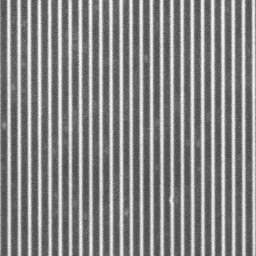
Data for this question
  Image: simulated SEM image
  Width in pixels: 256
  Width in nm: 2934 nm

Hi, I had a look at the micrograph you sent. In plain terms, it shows parallel lines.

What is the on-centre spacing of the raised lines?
117 nm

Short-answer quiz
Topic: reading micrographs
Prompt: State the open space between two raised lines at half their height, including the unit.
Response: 96 nm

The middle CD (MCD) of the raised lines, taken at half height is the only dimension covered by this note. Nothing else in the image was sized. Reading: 21.5 nanometers